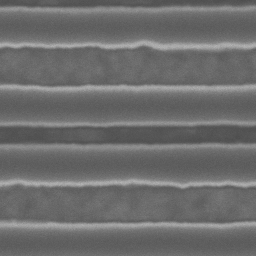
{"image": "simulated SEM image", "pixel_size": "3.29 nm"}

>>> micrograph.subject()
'lines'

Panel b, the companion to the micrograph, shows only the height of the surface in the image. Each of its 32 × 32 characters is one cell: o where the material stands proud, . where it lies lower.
................................
oooooooooooooooooooooooooooooooo
oooooooooooooooooooooooooooooooo
oooooooooooooooooooooooooooooooo
oooooooooooooooooooooooooooooooo
oooooooooooooooooooooooooooooooo
................................
................................
................................
................................
................................
oooooooooooooooooooooooooooooooo
oooooooooooooooooooooooooooooooo
oooooooooooooooooooooooooooooooo
oooooooooooooooooooooooooooooooo
oooooooooooooooooooooooooooooooo
................................
................................
oooooooooooooooooooooooooooooooo
oooooooooooooooooooooooooooooooo
oooooooooooooooooooooooooooooooo
oooooooooooooooooooooooooooooooo
oooooooooooooooooooooooooooooooo
................................
................................
................................
................................
................................
oooooooooooooooooooooooooooooooo
oooooooooooooooooooooooooooooooo
oooooooooooooooooooooooooooooooo
oooooooooooooooooooooooooooooooo